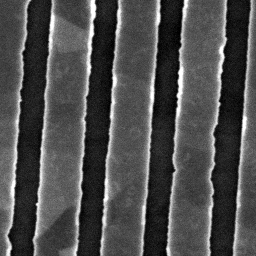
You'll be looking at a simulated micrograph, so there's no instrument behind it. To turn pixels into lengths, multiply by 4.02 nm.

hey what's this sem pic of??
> one or a few lines or trenches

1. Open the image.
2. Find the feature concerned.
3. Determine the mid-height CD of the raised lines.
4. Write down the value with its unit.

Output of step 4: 0.166 microns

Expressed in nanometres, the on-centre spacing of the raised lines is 265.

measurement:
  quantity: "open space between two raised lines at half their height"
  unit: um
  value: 0.0988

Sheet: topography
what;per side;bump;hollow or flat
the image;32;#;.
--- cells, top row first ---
####...#####...#####...#####...#
###....#####...#####...#####...#
###...######...#####...#####...#
###...######...#####...#####...#
###...######...#####...#####...#
###...#####....#####...#####...#
###...#####...######..######...#
###...#####...#####...######...#
###...#####...#####...######...#
###...#####...#####...######...#
###...#####...#####...######...#
###...#####...#####...#####....#
###...#####...#####...#####....#
##....#####...#####...#####....#
##....#####...#####...#####...##
##....#####...#####...#####...##
##...######...#####...#####...##
##...#####....#####...#####...##
##...#####....#####...#####...##
##...#####...######...#####...##
##...#####...######...#####...##
##...#####...#####....####....##
##...#####...#####....####....##
##...#####...#####....#####...##
##...#####...#####...######...##
##...#####...#####...######...##
##...#####...#####...#####....##
##...#####...#####...#####....##
#....#####...#####...#####....##
#...######...#####...#####...###
#...######...#####...#####...###
#...#####....#####...#####...###